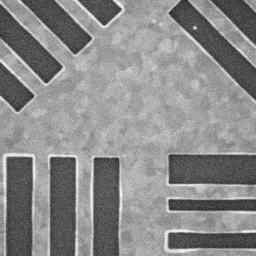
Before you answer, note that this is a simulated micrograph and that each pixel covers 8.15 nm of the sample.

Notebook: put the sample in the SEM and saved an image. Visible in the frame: groups of lines, slits or small figures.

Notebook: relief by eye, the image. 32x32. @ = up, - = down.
@@@----@@@-----@@@@@@@--@@@----@
-@@@----@@@----@@@@@@----@@@----
--@@@----@@@--@@@@@@@@----@@@---
---@@@----@@@@@@@@@@@@@----@@@--
----@@@----@@@@@@@@@@@@@----@@--
@----@@@---@@@@@@@@@@@@@@----@@@
@@----@@@-@@@@@@@@@@@@@@@@----@@
@@@----@@@@@@@@@@@@@@@@@@@@----@
-@@@----@@@@@@@@@@@@@@@@@@@@----
--@@@--@@@@@@@@@@@@@@@@@@@@@@---
---@@@@@@@@@@@@@@@@@@@@@@@@@@@--
----@@@@@@@@@@@@@@@@@@@@@@@@@@@-
----@@@@@@@@@@@@@@@@@@@@@@@@@@@@
@--@@@@@@@@@@@@@@@@@@@@@@@@@@@@@
@@@@@@@@@@@@@@@@@@@@@@@@@@@@@@@@
@@@@@@@@@@@@@@@@@@@@@@@@@@@@@@@@
@@@@@@@@@@@@@@@@@@@@@@@@@@@@@@@@
@@@@@@@@@@@@@@@@@@@@@@@@@@@@@@@@
@@@@@@@@@@@@@@@@@@@@@@@@@@@@@@@@
@---@@---@@@@@@@@@@@@-----------
----@@----@@---@@@@@@-----------
----@@----@@---@@@@@@-----------
@---@@----@----@@@@@@-----------
@---@@----@----@@@@@@@@@@@@@@@@@
@---@@----@----@@@@@@@@@@@@@@@@@
@---@@----@----@@@@@@-----------
@---@@----@----@@@@@@@-@@---@---
@---@@----@----@@@@@@@@@@@@@@@@@
@---@@----@@---@@@@@@@@@@@@@@@@@
@---@@----@@---@@@@@@-----------
@---@@----@----@@@@@@-----------
@---@@----@----@@@@@@@@@@@@@@@@@